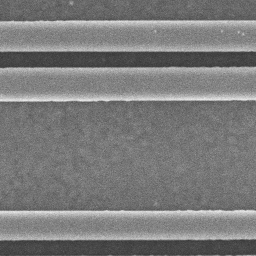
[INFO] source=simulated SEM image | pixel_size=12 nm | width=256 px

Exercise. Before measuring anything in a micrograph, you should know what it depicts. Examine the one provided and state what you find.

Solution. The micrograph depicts lines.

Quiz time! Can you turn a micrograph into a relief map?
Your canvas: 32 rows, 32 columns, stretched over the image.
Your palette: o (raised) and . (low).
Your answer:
................................
................................
................................
oooooooooooooooooooooooooooooooo
oooooooooooooooooooooooooooooooo
oooooooooooooooooooooooooooooooo
................................
................................
....................ooo..ooooooo
oooooooooooooooooooooooooooooooo
oooooooooooooooooooooooooooooooo
oooooooooooooooooooooooooooooooo
oooooooooooooo..o...............
................................
................................
................................
................................
................................
................................
................................
................................
................................
................................
................................
................................
................................
oooooooooooooooooooooooooooooooo
oooooooooooooooooooooooooooooooo
oooooooooooooooooooooooooooooooo
oooooooooooooooooooooooooooooooo
................................
................................